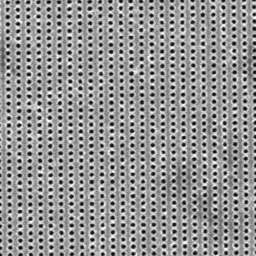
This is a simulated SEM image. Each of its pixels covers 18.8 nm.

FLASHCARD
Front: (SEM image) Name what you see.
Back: a regular array of holes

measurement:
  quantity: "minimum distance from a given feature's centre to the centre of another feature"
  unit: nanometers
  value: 134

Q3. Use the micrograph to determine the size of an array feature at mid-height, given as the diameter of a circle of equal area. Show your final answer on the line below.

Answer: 87.5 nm